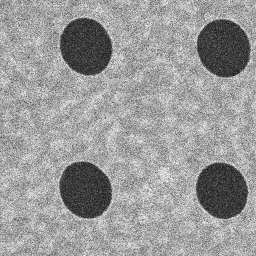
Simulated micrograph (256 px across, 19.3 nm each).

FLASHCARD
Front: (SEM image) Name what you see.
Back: holes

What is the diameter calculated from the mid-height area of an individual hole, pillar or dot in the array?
1.07 microns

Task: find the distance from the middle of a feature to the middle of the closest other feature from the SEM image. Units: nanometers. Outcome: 2650